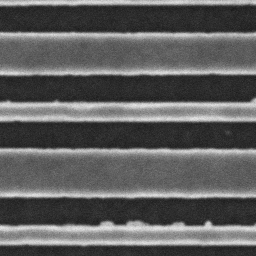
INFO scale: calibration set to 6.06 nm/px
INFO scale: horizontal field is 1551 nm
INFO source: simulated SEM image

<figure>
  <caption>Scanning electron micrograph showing lines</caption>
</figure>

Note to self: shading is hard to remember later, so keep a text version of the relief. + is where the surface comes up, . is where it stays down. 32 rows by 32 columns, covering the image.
++++++++++..+...+++.............
................................
................................
................................
++++++++++++++++++++++++++++++++
++++++++++++++++++++++++++++++++
++++++++++++++++++++++++++++++++
++++++++++++++++++++++++++++++++
++++++++++++++++++++++++++++++++
................................
................................
................................
................................
++++++++++++++++++++++++++++++++
++++++++++++++++++++++++++++++++
................................
................................
................................
................................
++++++++++++++++++++++++++++++++
++++++++++++++++++++++++++++++++
++++++++++++++++++++++++++++++++
++++++++++++++++++++++++++++++++
++++++++++++++++++++++++++++++++
++++++++++++++++++++++++++++++++
................................
................................
................................
++++++++++++++++++++++++++++++++
++++++++++++++++++++++++++++++++
++.......+++...+++++.....++++.++
................................